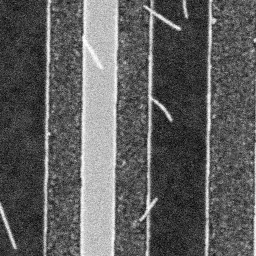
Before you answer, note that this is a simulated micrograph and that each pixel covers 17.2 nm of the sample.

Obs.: lines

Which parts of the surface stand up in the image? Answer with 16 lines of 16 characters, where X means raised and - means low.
XXX--XX--XXXX---
XXX--XX--XXXX---
XXX--XX--XXXX---
XXX--XX--XXXX---
XXX--XX--XXXX---
XXX--XX--XXXX---
XXX--XX--XXXX---
XXX--XX--XXXX---
XXX--XX--XXXX---
XXX--XX--XXXX---
XXX--XX--XXXX---
XXX--XX--XXXX---
XXX--XX--XXXX---
XXX--XX--XXXX---
XXX--XX--XXXX---
XXX--XX--XXXX---